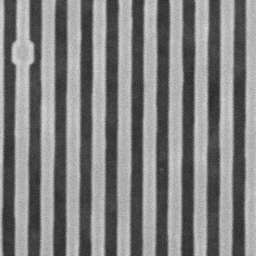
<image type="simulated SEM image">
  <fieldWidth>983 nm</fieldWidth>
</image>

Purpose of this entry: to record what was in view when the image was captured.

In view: wiring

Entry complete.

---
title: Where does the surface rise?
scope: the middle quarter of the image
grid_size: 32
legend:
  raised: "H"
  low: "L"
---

LHHHLLLHHHLLLLHHHLLLHHHLLLLHHLLL
LHHHLLLHHHLLLLHHHLLLHHHLLLLHHHLL
LHHHLLLHHHLLLLHHHLLLHHHLLLLHHHLL
LHHHLLLHHHLLLLHHHLLLHHHLLLLHHHLL
LHHHLLLHHHLLLLHHHLLLHHHLLLLHHHLL
LHHHLLLHHHLLLLHHHLLLHHHLLLLHHLLL
LHHHLLLHHHLLLLHHHLLLHHHLLLLHHLLL
LHHHLLLHHHLLLLHHHLLLHHHLLLLHHLLL
LHHHLLLHHHLLLLHHHLLLHHHLLLLHHLLL
LHHHLLLHHHLLLLHHHLLLHHHLLLLHHLLL
LHHHLLLHHHLLLLHHHLLLHHHLLLLHHLLL
LHHHLLLHHHLLLLHHHLLLHHHLLLHHHLLL
LHHHLLLHHHLLLLHHHLLLHHHLLLHHHLLL
LHHHLLLHHHLLLLHHHLLLHHHLLLHHHLLL
LHHHLLLHHHLLLLHHHLLLHHHLLLHHHLLL
LHHHLLLHHHLLLLHHHLLLHHHLLLHHHLLL
LHHHLLLHHHLLLLHHHLLLHHHLLLHHHLLL
LHHHLLLHHHLLLLHHHLLLHHHLLLHHHLLL
LHHHLLLHHHLLLLHHHLLLHHHLLLHHHLLL
LHHHLLLHHHLLLLHHHLLLHHHLLLHHHLLL
LHHHLLLHHHLLLLHHHLLLHHHLLLHHHLLL
LHHHLLLHHHLLLLHHHLLLHHHLLLHHHLLL
LHHHLLLHHHLLLLHHHLLLHHHLLLHHHLLL
LHHHLLLHHHLLLLHHHLLLHHHLLLHHHLLL
LHHHLLLHHHLLLLHHHLLLHHHLLLHHHLLL
LHHHLLLHHHLLLLHHHLLLHHHLLLHHHLLL
LHHHLLLHHHLLLLHHHLLLHHHLLLHHHLLL
LHHHLLLHHHLLLLHHHLLLHHHLLLHHHLLL
LHHHLLLHHHLLLLHHLLLLHHHLLLHHHLLL
LHHHLLLHHHLLLLHHLLLLHHHLLLHHHLLL
LHHHLLLHHHLLLLHHLLLLHHHLLLHHHLLL
LHHHLLLHHHLLLLHHLLLLHHHLLLHHHLLL